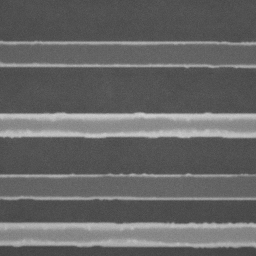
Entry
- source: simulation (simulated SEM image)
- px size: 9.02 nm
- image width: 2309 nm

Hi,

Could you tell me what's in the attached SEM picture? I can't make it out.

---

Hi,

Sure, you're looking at lines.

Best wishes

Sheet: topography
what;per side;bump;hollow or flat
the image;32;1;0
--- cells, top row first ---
00000000000000000000000000000000
00000000000000000000000000000000
00000000000000000000000000000000
00000000000000000000000000000000
00000000000000000000000000000000
11111111111111111111111111111111
11111111111111111111111111111111
11111111111111111111111111111111
00000000000000000000000000000000
00000000000000000000000000000000
00000000000000000000000000000000
00000000000000000000000000000000
00000000000000000000000000000000
00000000000000000000000000000000
11111111111001111111110011111111
11111111111111111111111111111111
11111111111111111111111111111111
00000000000000000000000000000000
00000000000000000000000000000000
00000000000000000000000000000000
00000000000000000000000000000000
00000000000000000000000000000000
11111111111111111111111111111111
11111111111111111111111111111111
11111111111111111111111111111111
00000000000000000000000000000000
00000000000000000000000000000000
00000000000000000000000000000000
11111111111111111111111111111111
11111111111111111111111111111111
11111111111111111111111111111111
00000000000000000000000000000000